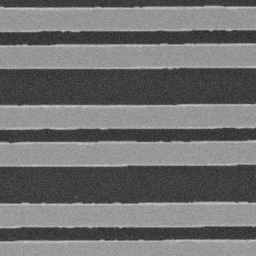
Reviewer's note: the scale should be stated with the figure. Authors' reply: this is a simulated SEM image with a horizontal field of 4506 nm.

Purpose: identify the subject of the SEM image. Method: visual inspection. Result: lines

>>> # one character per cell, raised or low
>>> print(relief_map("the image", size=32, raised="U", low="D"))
DDDDDDDDDDDDDDDDDDDDDDDDDDDDDDDD
UUUUUUUUUUUUUUUUUUUUUUUUUUUUUUUU
UUUUUUUUUUUUUUUUUUUUUUUUUUUUUUUU
UUUUUUUUUUUUUUUUUUUUUUUUUUUUUUUU
DDDDDDDDDDDDDDDDDDDDDDDDDDDDDDDD
DDDDDDDDDDDDDDDDDDDDDDDDDDDDDDDD
UUUUUUUUUUUUUUUUUUUUUUUUUUUUUUUU
UUUUUUUUUUUUUUUUUUUUUUUUUUUUUUUU
UUUUUUUUUUUUUUUUUUUUUDDDDDDDDDDD
DDDDDDDDDDDDDDDDDDDDDDDDDDDDDDDD
DDDDDDDDDDDDDDDDDDDDDDDDDDDDDDDD
DDDDDDDDDDDDDDDDDDDDDDDDDDDDDDDD
DDDDDDDDDDDDDDDDDDDDDDDDDDDDDDDD
UUUUUUUUUUUUUUUUUUUUUUUUUUUUUUUU
UUUUUUUUUUUUUUUUUUUUUUUUUUUUUUUU
UUUUUUUUUUUUUUUUUUUUUUUUUUUUUUUU
DDDDDDDDDDDDDDDDDDDDDDDDDDDDDDDD
DDDDDDDDDDDDDDDDDDDDDDDDDDDDDDDD
UUUUUUUUUUUUUUUUUUUUUUUUUUUUUUUU
UUUUUUUUUUUUUUUUUUUUUUUUUUUUUUUU
UUUUUUUUUUUUUUUUUUUUUUUUUUUUUUDD
DDDDDDDDDDDDDDDDDDDDDDDDDDDDDDDD
DDDDDDDDDDDDDDDDDDDDDDDDDDDDDDDD
DDDDDDDDDDDDDDDDDDDDDDDDDDDDDDDD
DDDDDDDDDDDDDDDDDDDDDDDDDDDDDDDD
DDDDDDDDDUDDDDUDDUUUUUUUUUUUUUUU
UUUUUUUUUUUUUUUUUUUUUUUUUUUUUUUU
UUUUUUUUUUUUUUUUUUUUUUUUUUUUUUUU
DDDDDDDDDDDDDDDDDDDDDDDDDDDDDDDD
DDDDDDDDDDDDDDDDDDDDDDDDDDDDDDDD
UUUUUUUUUUUUUUUUUUUUUUUUUUUUUUUU
UUUUUUUUUUUUUUUUUUUUUUUUUUUUUUUU